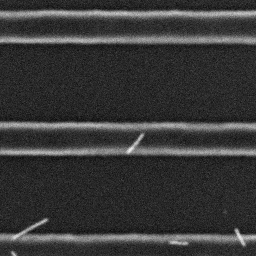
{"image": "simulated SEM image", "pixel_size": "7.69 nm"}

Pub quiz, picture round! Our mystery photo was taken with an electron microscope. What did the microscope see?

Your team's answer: lines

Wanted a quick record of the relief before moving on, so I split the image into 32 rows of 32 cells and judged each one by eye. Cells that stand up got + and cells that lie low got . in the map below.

................................
.....++.....+........+..........
++++++++++++++++++++++++++++++++
++++++++++++++++++++++++++++++++
++++++++++++++++++++++++++++++++
................................
................................
................................
................................
................................
................................
................................
................................
................................
................................
................................
++++++++++++++++++++++++++++++++
++++++++++++++++++++++++++++++++
++++++++++++++++++++++++++++++++
................................
................................
................................
................................
................................
................................
................................
................................
................................
................................
.............................+..
++++++++++++++++++++++++++++++++
++++++++++++++++++++++++++++++++